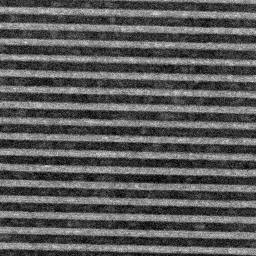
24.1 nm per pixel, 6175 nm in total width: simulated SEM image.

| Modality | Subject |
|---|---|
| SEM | parallel lines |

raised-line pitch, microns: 0.379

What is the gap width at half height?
238 nm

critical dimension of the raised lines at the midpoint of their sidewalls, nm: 142